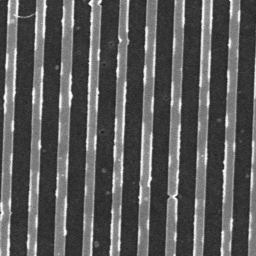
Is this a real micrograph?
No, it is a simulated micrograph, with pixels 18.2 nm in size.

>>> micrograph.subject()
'parallel lines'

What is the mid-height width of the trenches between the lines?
323 nanometres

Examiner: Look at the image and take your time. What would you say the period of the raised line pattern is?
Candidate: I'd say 505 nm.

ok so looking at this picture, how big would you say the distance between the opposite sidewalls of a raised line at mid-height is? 0.178 µm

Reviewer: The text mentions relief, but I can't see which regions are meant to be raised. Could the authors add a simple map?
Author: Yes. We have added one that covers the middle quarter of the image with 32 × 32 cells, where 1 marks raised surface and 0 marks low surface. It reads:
11000011100001110000111000011000
11000011100001110000111000011000
11000011000001100000111000011000
11000011000001100000111000011000
11000011000001100000110000011000
11000011000001100000110000011000
11000011100001100000110000011000
11000011100001100000110000011000
11000011000001100000110000011000
11000011000001100000110000011000
11000011000001100000110000011000
10000011000001100000110000011000
10000011000001100000110000011000
10000011000001100000110000011000
10000011000001100000110000011000
10000011000001100000110000011000
10000011000001100000110000011000
10000011000001100000110000011000
10000011000001100000110000111000
10000011000001100001110000111000
10000011000001100001110000111000
10000011000001100001110000111000
10000011000001100001110000111000
10000011000011100001110000111000
10000011000001100001110000111000
10000011000001100001110000111000
10000011000011100001110000111000
10000111000011100001110000111000
10000111000011100001110000111000
10000110000011100001110000111000
10000110000011000001100000110000
10000110000011000001100000110000